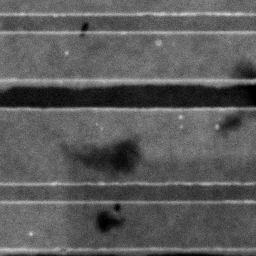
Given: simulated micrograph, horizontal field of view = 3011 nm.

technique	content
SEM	lines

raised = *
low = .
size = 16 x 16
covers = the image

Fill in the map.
****************
****************
****************
****************
****************
................
................
****************
****************
****************
****************
****************
****************
****************
****************
****************